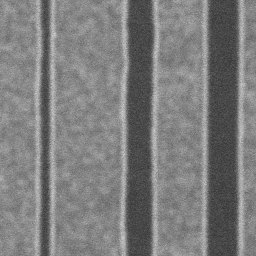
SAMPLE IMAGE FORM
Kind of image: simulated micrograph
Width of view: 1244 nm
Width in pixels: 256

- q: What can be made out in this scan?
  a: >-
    one or a few lines or trenches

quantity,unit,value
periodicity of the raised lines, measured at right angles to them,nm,432